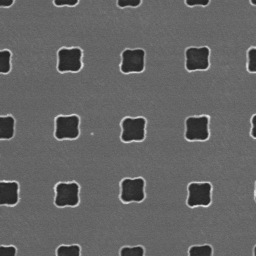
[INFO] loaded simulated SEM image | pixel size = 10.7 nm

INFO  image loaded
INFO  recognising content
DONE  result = a regular array of holes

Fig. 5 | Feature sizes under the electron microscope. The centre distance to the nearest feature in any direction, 682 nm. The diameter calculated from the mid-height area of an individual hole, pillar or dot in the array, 260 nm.